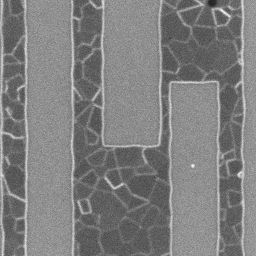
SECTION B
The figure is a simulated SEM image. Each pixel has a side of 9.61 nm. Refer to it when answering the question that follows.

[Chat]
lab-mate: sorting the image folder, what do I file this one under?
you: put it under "groups of lines, slits or small figures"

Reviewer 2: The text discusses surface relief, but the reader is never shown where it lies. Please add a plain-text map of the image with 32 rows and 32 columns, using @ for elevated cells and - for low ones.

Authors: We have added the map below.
@@@------@@@--------@@@@@@@@@@--
@@@------@@@@-------@@@@@@@@@@--
@@@------@@@@-------@@@@@@@@@@--
@@@------@@@@-------@@@@@@@@@@--
@@@------@@@@-------@@@@@@@@@@--
@@@------@@@@-------@@@@@@@@@@--
@@@------@@@@-------@@@@@@@@@@--
@@@------@@@@-------@@@@@@@@@@--
@@@------@@@@-------@@@@@@@@@@--
@@@------@@@@-------@@@@@@@@@@--
@@@------@@@@-------@------@@@--
@@@------@@@@-------@------@@@--
@@@------@@@@-------@------@@@@-
@@@------@@@@-------@------@@@@-
@@@------@@@@-------@------@@@@-
@@@------@@@@-------@------@@@--
@@@------@@@@-------@------@@@--
@@@------@@@@-------@------@@@--
@@@------@@@@@@@@@@@@------@@@--
@@@------@@@@@@@@@@@@------@@@--
-@@------@@@@@@@@@@@@------@@@--
@@@------@@@@@@@@@@@@------@@@--
@@@------@@@@@@@@@@@@------@@@--
@@@------@@@@@@@@@@@@------@@@--
@@@------@@@@@@@@@@@@------@@@--
@@@------@@@@@@@@@@@@------@@@--
@@@------@@@@@@@@@@@@------@@@--
@@@------@@@@@@@@@@@@------@@@--
@@@------@@@@@@@@@@@@------@@@--
@@@------@@@@@@@@@@@@------@@@--
@@@------@@@@@@@@@@@@------@@@--
@@@------@@@@@@@@@@@@------@@@--